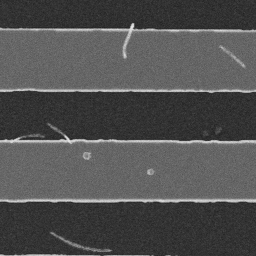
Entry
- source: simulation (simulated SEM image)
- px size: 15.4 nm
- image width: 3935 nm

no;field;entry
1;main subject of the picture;lines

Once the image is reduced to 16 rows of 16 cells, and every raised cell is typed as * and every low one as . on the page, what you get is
................
................
****************
****************
****************
****************
................
................
................
****************
****************
****************
****************
................
................
................